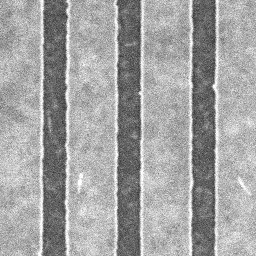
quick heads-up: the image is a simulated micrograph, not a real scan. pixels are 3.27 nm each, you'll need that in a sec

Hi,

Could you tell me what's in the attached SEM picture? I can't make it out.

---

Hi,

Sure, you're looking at one or a few lines or trenches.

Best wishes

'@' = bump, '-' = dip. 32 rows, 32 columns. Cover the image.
@@@@@----@@@@@@---@@@@@@---@@@@@
@@@@@---@@@@@@@---@@@@@@---@@@@@
@@@@@----@@@@@@---@@@@@@---@@@@@
@@@@@---@@@@@@@---@@@@@@---@@@@@
@@@@@---@@@@@@@---@@@@@@---@@@@@
@@@@@---@@@@@@@---@@@@@@---@@@@@
@@@@@---@@@@@@@---@@@@@@---@@@@@
@@@@@---@@@@@@@---@@@@@@---@@@@@
@@@@@---@@@@@@@---@@@@@@---@@@@@
@@@@@---@@@@@@@---@@@@@@---@@@@@
@@@@@---@@@@@@@---@@@@@@---@@@@@
@@@@@---@@@@@@@---@@@@@@---@@@@@
@@@@@---@@@@@@@---@@@@@@---@@@@@
@@@@@---@@@@@@@---@@@@@@---@@@@@
@@@@@---@@@@@@@---@@@@@@---@@@@@
@@@@@---@@@@@@@---@@@@@@---@@@@@
@@@@@---@@@@@@@---@@@@@@---@@@@@
@@@@@---@@@@@@@---@@@@@@---@@@@@
@@@@@---@@@@@@@---@@@@@@---@@@@@
@@@@@---@@@@@@@---@@@@@@---@@@@@
@@@@@---@@@@@@@---@@@@@@---@@@@@
@@@@@---@@@@@@@---@@@@@@---@@@@@
@@@@@---@@@@@@@---@@@@@@---@@@@@
@@@@@---@@@@@@@---@@@@@@---@@@@@
@@@@@---@@@@@@@---@@@@@@---@@@@@
@@@@@---@@@@@@@---@@@@@@---@@@@@
@@@@@---@@@@@@@---@@@@@@---@@@@@
@@@@@---@@@@@@@---@@@@@@---@@@@@
@@@@@---@@@@@@@---@@@@@@---@@@@@
@@@@@---@@@@@@@---@@@@@@---@@@@@
@@@@@---@@@@@@@---@@@@@@---@@@@@
@@@@@---@@@@@@----@@@@@@---@@@@@